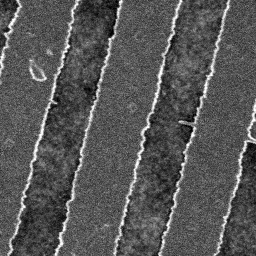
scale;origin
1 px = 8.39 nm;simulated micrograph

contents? one or a few lines or trenches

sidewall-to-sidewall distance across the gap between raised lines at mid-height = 43.7 pixels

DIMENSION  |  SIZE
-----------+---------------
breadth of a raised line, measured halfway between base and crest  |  0.481 microns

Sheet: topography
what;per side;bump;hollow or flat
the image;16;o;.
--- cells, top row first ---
.oooo..oooo...oo
.ooo...oooo...oo
oooo...oooo...oo
oooo...ooo...ooo
oooo..oooo...ooo
ooo...oooo...ooo
ooo...oooo..oooo
ooo...ooo...oooo
ooo..oooo...oooo
oo...oooo...ooo.
oo...oooo..oooo.
oo...ooo...oooo.
o...oooo...oooo.
o...oooo...ooo..
o...oooo..oooo..
o...ooo...oooo..